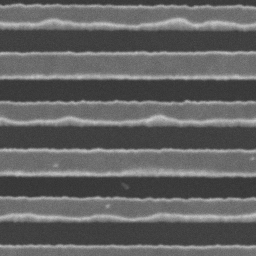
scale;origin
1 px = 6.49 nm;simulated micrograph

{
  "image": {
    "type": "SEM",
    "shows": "lines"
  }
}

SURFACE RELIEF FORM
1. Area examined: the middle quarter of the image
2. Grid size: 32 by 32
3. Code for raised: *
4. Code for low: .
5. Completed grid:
********************************
********************************
********************************
********************************
................................
................................
................................
................................
................................
.**.******.*******.*****...*..**
********************************
********************************
********************************
********************************
*.*********************..*******
................................
................................
................................
................................
................................
................................
********************************
********************************
********************************
********************************
********************************
********************************
********************************
................................
................................
................................
................................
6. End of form